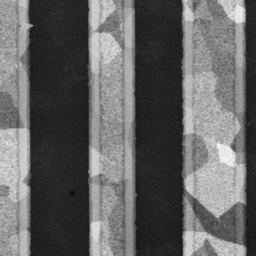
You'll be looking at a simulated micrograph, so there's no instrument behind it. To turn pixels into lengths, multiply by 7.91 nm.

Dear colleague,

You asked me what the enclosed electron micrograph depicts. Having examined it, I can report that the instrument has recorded one or a few lines or trenches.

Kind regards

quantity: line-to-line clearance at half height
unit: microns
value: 0.518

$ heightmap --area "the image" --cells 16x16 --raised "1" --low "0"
1000001100001110
1000001100001110
1000001100001110
1000001100001110
1000001100001110
1000001100001110
1000001100001110
1000001100001110
1000001100001110
1000001100001110
1100001100001110
1000001100001110
1000001100001110
1000001100001110
1000001100001110
1000001100001110